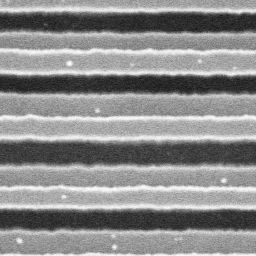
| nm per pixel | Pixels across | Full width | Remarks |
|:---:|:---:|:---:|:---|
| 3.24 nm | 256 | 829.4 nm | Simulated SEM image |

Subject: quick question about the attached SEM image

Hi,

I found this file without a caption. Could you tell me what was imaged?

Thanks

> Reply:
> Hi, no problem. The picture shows lines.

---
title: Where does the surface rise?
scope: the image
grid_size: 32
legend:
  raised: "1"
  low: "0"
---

11111111111111111111111111111111
00000000000000000000000000001101
00000000000000000000000000000000
00000000000000000000000000000000
11111111111111111111111111111111
11111111111111111111111111111111
11111111111111111111111111111111
11111111111111111111111111111111
11111111111111111111111111111111
00000000000000000000000000000000
00000000000000000000000000000000
00000000000000000000000000000000
11111111111111111111111111111111
11111111111111111111111111111111
11111111111111111111111111111111
11111111111111111111111111111111
11111111111111111111111111111111
00000110000111111001000000011000
00000000000000000000000000000000
00000000000000000000000000000000
00000000000000000000000000000000
11111111111111111111111111111111
11111111111111111111111111111111
11111111111111111111111111111111
11111111111111111111111111111111
11111111111111111111111111111111
00000000000000000000000000000000
00000000000000000000000000000000
00000000000000000000000000000000
11111111111111111111111111111111
11111111111111111111111111111111
11111111111111111111111111111111